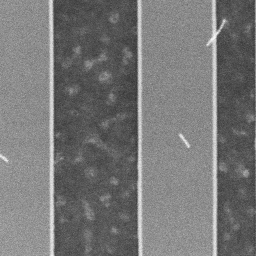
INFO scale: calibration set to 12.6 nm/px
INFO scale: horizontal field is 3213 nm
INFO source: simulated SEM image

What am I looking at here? one or a few lines or trenches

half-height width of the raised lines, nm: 938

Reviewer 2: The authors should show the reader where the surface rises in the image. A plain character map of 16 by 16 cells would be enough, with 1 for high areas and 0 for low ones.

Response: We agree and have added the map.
1110000001111000
1110000001111000
1110000001111000
1110000001111000
1110000001111000
1110000001111000
1110000001111000
1110000001111000
1110000001111000
1110000001111000
1110000001111000
1110000001111000
1110000001111000
1110000001111000
1110000001111000
1110000001111000